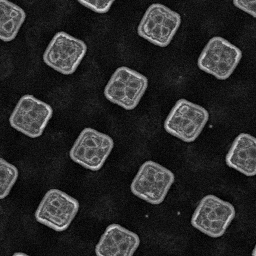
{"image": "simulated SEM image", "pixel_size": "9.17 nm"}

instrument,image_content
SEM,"a regular array of raised bodies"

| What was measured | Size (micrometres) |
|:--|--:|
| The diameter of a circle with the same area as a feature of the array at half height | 0.344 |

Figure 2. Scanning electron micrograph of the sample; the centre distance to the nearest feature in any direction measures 634 nanometers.